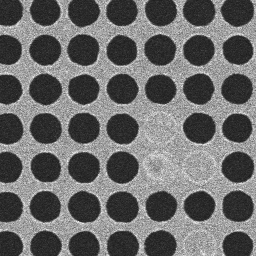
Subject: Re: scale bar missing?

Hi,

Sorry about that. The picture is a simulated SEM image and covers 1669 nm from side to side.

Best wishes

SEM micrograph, a regular array of holes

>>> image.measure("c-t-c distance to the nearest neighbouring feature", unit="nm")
250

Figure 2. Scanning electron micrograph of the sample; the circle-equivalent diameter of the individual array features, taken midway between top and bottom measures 205 nm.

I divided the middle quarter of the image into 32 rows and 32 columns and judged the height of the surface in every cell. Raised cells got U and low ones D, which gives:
UUUUUDUUUUUUUUUUUUUUUUUUDUUUUUUU
UUUUUUUUUUUUUUUUUUUUUUUUUUUUUUUU
UUUUUUUUUUUUUUUUUUUUUUUUDUUUUUUU
UUDDDDDUUUUUDDDDDUUUUDDDDDDUUUUD
UDDDDDDDUUUDDDDDDDUUUDDDDDDUUUDD
UDDDDDDDDUUDDDDDDDUUDDDDDDDDUUDD
UDDDDDDDDUUDDDDDDDDUDDDDDDDDUUDD
UDDDDDDDDUUDDDDDDDUUDDDDDDDDUUDD
UUDDDDDDUUUDDDDDDDUUUDDDDDDUUUUD
UUUDDDDUUUUUDDDDDUUUUUDDDDUUUUUU
UUUUUUUUUUUUUUUUUUUUUUUUUUUUUUUU
UUUUUUUUUUUUUUUUUUUUUUUUUUUUUUUU
UUUDDDDUUUUUUDDDUUUUUUUUUUUUUUUU
UUDDDDDDUUUDDDDDDUUUUUUUUUUUUUUD
UDDDDDDDDUUDDDDDDDUUUUUUUUUUUUDD
UDDDDDDDDUUDDDDDDDDUUUUUUUUUUUDD
UDDDDDDDDUUDDDDDDDDUUUUUUUUUUUDD
UDDDDDDDDUUDDDDDDDUUUUUUUUUUUUDD
UUDDDDDDUUUDDDDDDDUUUUUUUUUUUUUD
UUUDDDDUUUUUUDDDDUUUUUUUUUUUUUUU
UUUUUUUUUUUUUUUUUUUUUUUUUUUUUUUU
UUUUUUUUUUUUUUUUUUUUUUUUUUUUUUUU
UUUDDDDUUUUUDDDDDUUUUUUUUUUUUUUU
UUDDDDDDUUUDDDDDDDUUUUUUUUUUUUUU
UDDDDDDDDUUDDDDDDDUUUUUUUUUUUUUU
UDDDDDDDDUUDDDDDDDDUUUUUUUUUUUUU
UDDDDDDDDUUDDDDDDDDUUUUUUUUUUUUU
UDDDDDDDDUUDDDDDDDUUUUUUUUUUUUUU
UUDDDDDDUUUDDDDDDUUUUUUUUUUUUUUU
UUUDDDDUUUUUUDDDUUUUUUUUUUUUUUUU
UUUUUUUUUUUUUUUUUUUUUUUUUUUUUUUU
UUUUUUUUUUUUUUUUUUUUUUUUUUUUUUUU